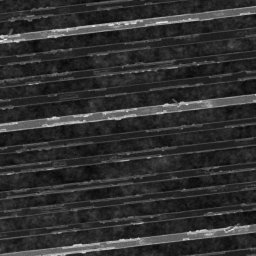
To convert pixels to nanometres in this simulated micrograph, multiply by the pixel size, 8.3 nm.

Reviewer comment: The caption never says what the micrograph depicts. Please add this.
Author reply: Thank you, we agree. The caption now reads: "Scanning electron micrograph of parallel lines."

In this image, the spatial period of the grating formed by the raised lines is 180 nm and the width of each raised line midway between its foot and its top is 64.9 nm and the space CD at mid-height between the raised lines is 0.113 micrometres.